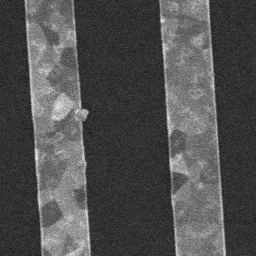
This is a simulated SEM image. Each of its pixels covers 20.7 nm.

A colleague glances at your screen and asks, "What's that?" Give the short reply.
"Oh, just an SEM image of one or a few lines or trenches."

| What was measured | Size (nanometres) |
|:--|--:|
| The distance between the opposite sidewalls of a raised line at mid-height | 991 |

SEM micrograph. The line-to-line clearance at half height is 1.78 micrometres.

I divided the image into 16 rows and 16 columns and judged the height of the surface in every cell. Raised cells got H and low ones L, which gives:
LLHHHLLLLLHHHLLL
LLHHHLLLLLHHHLLL
LLHHHLLLLLHHHLLL
LLHHHLLLLLHHHLLL
LLHHHLLLLLHHHLLL
LLHHHLLLLLHHHLLL
LLHHHLLLLLHHHLLL
LLHHHLLLLLHHHLLL
LLHHHLLLLLLHHHLL
LLHHHLLLLLLHHHLL
LLHHHLLLLLLHHHLL
LLHHHLLLLLLHHHLL
LLHHHLLLLLLHHHLL
LLHHHLLLLLLHHHLL
LLLHHHLLLLLHHHLL
LLLHHHLLLLLHHHLL